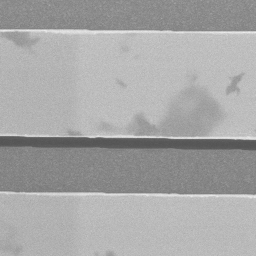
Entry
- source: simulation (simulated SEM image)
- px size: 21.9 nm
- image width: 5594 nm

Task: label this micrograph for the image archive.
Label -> lines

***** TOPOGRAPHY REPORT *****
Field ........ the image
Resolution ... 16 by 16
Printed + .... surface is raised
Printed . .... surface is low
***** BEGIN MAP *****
................
................
++++++++++++++++
++++++++++++++++
++++++++++++++++
++++++++++++++++
++++++++++++++++
++++++++++++++++
.+++++++++++++++
................
................
................
++++++++++++++++
++++++++++++++++
++++++++++++++++
++++++++++++++++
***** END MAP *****